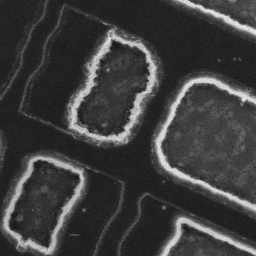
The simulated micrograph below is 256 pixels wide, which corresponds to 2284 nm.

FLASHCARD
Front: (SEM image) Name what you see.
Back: one or a few lines or trenches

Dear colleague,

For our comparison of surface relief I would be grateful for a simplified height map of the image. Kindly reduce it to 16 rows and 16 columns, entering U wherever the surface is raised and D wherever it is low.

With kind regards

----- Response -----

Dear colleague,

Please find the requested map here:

UUUUUUUUUUUUUDDD
UUUUUUUUUUUUUUUD
UUUUUUUUUUUUUUUU
UUUUUUDDDUUUUUUU
UUUUUUDDDUUUUUUU
UUUUUUDDDUUUDDUU
UUUUUDDDDUUDDDDD
UUUUUDDDUUUDDDDD
UUUUUUDUUUDDDDDD
UUUUUUUUUUDDDDDD
UUDDUUUUUUUDDDDD
UDDDDUUUUUUUUDDD
UDDDDUUUUUUUUUUD
UDDDUUUUUUUUUUUU
UDDUUUUUUUUDDUUU
UUUUUUUUUUUDDDDU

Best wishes